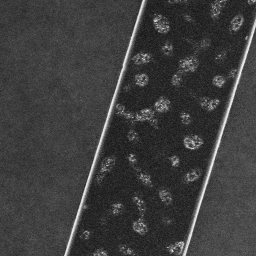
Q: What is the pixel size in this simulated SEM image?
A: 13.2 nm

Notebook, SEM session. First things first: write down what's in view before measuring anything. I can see one or a few lines or trenches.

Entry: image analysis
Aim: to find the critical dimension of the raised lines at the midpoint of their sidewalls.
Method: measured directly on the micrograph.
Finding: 1.5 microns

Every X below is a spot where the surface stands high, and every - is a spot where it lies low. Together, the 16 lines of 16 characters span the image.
---------XXXXXXX
---------XXXXXXX
--------XXXXXXXX
--------XXXXXXX-
--------XXXXXXX-
-------XXXXXXXX-
-------XXXXXXX--
-------XXXXXXX--
------XXXXXXXX--
------XXXXXXX---
------XXXXXXX---
-----XXXXXXXX---
-----XXXXXXXX---
-----XXXXXXX----
-----XXXXXXX----
----XXXXXXXX----